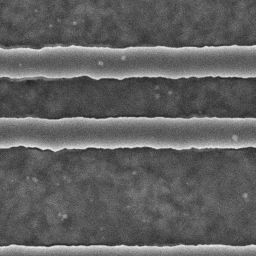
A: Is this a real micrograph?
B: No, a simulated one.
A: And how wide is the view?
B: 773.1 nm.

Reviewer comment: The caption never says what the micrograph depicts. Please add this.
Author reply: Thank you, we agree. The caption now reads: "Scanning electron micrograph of lines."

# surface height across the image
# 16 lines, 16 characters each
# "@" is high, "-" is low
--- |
----------------
----------------
----------------
@@@@@@@@@@@@@@@@
@@@@@@@@@@@@@@@@
----------------
----------------
@@@@@@@@@@@@@@@@
@@@@@@@@@@@@@@@@
----------------
----------------
----------------
----------------
----------------
----------------
@@@@@@@@@@@@@@@@